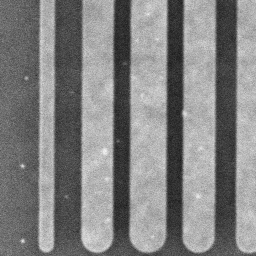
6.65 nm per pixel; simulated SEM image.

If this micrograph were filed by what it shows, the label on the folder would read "groups of lines, slits or small figures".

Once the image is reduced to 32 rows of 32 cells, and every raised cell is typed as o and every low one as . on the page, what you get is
.....oo...oooo..ooooo..oooo...oo
.....oo...oooo..ooooo..oooo...oo
.....oo...oooo..ooooo..oooo...oo
.....oo...oooo..ooooo..oooo...oo
.....oo...oooo..ooooo..oooo...oo
.....oo...oooo..ooooo..oooo...oo
.....oo...oooo..ooooo..oooo...oo
.....oo...oooo..ooooo..oooo...oo
.....oo...oooo..ooooo..oooo...oo
.....oo...oooo..ooooo..oooo...oo
.....oo...oooo..ooooo..oooo...oo
.....oo...oooo..ooooo..oooo...oo
.....oo...oooo..ooooo..oooo...oo
.....oo...oooo..ooooo..oooo...oo
.....oo...oooo..ooooo..oooo...oo
.....oo...oooo..ooooo..oooo...oo
.....oo...oooo..ooooo..oooo...oo
.....oo...oooo..ooooo..oooo...oo
.....oo...oooo..ooooo..oooo...oo
.....oo...oooo..ooooo..oooo...oo
.....oo...oooo..ooooo..oooo...oo
.....oo...oooo..ooooo..oooo...oo
.....oo...oooo..ooooo..oooo...oo
.....oo...oooo..ooooo..oooo...oo
.....oo...oooo..ooooo..oooo...oo
.....oo...oooo..ooooo..oooo...oo
.....oo...oooo..ooooo..oooo...oo
.....oo...oooo..ooooo..oooo...oo
.....oo...oooo..ooooo..oooo...oo
.....oo...oooo..ooooo..oooo...oo
.....oo....ooo...ooo...oooo...oo
...............................o